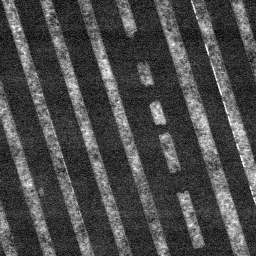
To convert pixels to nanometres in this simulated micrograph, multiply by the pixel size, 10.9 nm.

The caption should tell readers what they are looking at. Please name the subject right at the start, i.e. parallel lines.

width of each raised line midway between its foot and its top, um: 0.281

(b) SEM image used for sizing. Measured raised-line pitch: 398 nanometers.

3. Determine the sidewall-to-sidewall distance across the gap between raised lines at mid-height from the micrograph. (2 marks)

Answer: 113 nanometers